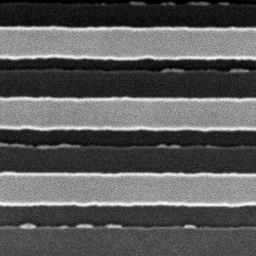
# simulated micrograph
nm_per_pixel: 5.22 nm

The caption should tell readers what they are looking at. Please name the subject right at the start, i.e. lines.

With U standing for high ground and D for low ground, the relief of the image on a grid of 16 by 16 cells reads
DDDDDDDDDDDDDDDD
DDDDDDDDDDDDDDDD
UUUUUUUUUUUUUUUU
UUUUUUUUUUUUUUUU
DDDDDDDDDDDDDDDD
DDDDDDDDDDDDDDDD
UUUUUUUUUUUUUUUU
UUUUUUUUUUUUUUUU
DDDDDDDDDDDDDDDD
DDDDDDDDDDDDDDDD
DDDDDDDDDDDDDDDD
UUUUUUUUUUUUUUUU
UUUUUUUUUUUUUUUU
DDDDDDDDDDDDDDDD
DDDDDDDDDDDDDDDD
DDDDDDDDDDDDDDDD